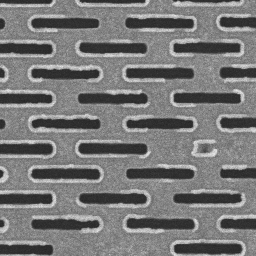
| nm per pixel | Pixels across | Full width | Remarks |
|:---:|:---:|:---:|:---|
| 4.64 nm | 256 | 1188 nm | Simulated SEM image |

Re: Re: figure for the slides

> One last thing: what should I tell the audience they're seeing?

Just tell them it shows a regular array of holes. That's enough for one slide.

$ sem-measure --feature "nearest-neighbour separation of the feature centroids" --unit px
50.1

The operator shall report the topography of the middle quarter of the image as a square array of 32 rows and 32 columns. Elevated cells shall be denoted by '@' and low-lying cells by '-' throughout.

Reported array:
@@@@@@@@@@@@@@@@@@@@@@@@@@@@@@@@
-@@@@@--@@@@@@@@----------------
---------@@@@@@-----------------
--------@@@@@@@@----------------
@@@@@@@@@@@@@@@@@@@@@@@@@@@@@@@@
@@@@@@@@@@@@@@@@@@@@@@@@@@@@@@@@
@@@@@@@@@@@@@@@@@@@@@@@@@@@@@@@@
@@@@------@@@@-@@---@@@@@@@@----
@@@@-----------------@@@@@@-----
@@@@-----------------@@@@@@@----
@@@@@@@@@@@@@@@@@@@@@@@@@@@@@@@@
@@@@@@@@@@@@@@@@@@@@@@@@@@@@@@@@
@@@@@@@@@@@@@@@@@@@@@@@@@@@@@@@@
@@@@@@@@@@@@@@@@@@@@@@@@@@@@@@@@
---------@@@@@@@----------------
---------@@@@@@@----------------
@@@@@@@@@@@@@@@@@@@@@@@@@@@@@@@@
@@@@@@@@@@@@@@@@@@@@@@@@@@@@@@@@
@@@@@@@@@@@@@@@@@@@@@@@@@@@@@@@@
@@@@@@@@@@@@@@@@@@@@@@@@@@@@@@@@
@@@@-----------------@@@@@@@@@@@
@@@@-----------------@@@@@@@@@@@
@@@@-------@@@@@@@@-@@@@@@@@@@@@
@@@@@@@@@@@@@@@@@@@@@@@@@@@@@@@@
@@@@@@@@@@@@@@@@@@@@@@@@@@@@@@@@
@@@@@@@@@@@@@@@@@@@@@@@@@@@@@@@@
--------@@@@@@@@----------------
---------@@@@@@@----------------
---------@@@@@@@----------------
@@@@@@@@@@@@@@@@@@@@@@@@@@@@@@@@
@@@@@@@@@@@@@@@@@@@@@@@@@@@@@@@@
@@@@@@@@@@@@@@@@@@@@@@@@@@@@@@@@